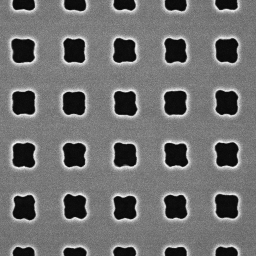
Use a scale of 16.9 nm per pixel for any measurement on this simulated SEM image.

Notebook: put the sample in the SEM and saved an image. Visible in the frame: a regular array of holes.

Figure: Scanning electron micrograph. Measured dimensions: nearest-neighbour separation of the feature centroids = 0.856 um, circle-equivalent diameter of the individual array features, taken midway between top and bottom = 422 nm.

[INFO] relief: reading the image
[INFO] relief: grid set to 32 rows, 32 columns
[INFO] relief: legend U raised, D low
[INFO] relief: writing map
UUDDUUUUDDDUUUDDDUUUUDDUUUUDDDUU
UUUUUUUUUUUUUUUUUUUUUUUUUUUUUUUU
UUUUUUUUUUUUUUUUUUUUUUUUUUUUUUUU
UUUUUUUUUUUUUUUUUUUUUUUUUUUUUUUU
UUUUUUUUUUUUUUUUUUUUUUUUUUUUUUUU
UDDDUUUUDDDUUUDDDUUUUDDUUUUDDDUU
UUDDUUUUDDDUUUDDDUUUUDDUUUUDDDUU
UUDDUUUUDDDUUUDDDUUUUDDUUUUDDDUU
UUUUUUUUUUUUUUUUUUUUUUUUUUUUUUUU
UUUUUUUUUUUUUUUUUUUUUUUUUUUUUUUU
UUUUUUUUUUUUUUUUUUUUUUUUUUUUUUUU
UUDDUUUUUDUUUUUDUUUUUDDUUUUDDUUU
UUDDUUUUDDDUUUDDDUUUUDDUUUUDDDUU
UUDDUUUUDDDUUUDDDUUUUDDUUUUDDDUU
UUUUUUUUUUUUUUUUUUUUUUUUUUUUUUUU
UUUUUUUUUUUUUUUUUUUUUUUUUUUUUUUU
UUUUUUUUUUUUUUUUUUUUUUUUUUUUUUUU
UUUUUUUUUUUUUUUUUUUUUUUUUUUUUUUU
UUDDUUUUDDDUUUDDDUUUUDDUUUUDDDUU
UUDDUUUUDDDUUUDDDUUUUDDUUUUDDDUU
UUDDUUUUDDDUUUDDDUUUUDDUUUUDDDUU
UUUUUUUUUUUUUUUUUUUUUUUUUUUUUUUU
UUUUUUUUUUUUUUUUUUUUUUUUUUUUUUUU
UUUUUUUUUUUUUUUUUUUUUUUUUUUUUUUU
UUDDUUUUDDUUUUUUUUUUUDDUUUUDDUUU
UUDDUUUUDDDUUUDDDUUUUDDUUUUDDDUU
UUDDUUUUDDDUUUDDDUUUUDDUUUUDDDUU
UUUUUUUUUUUUUUUUUUUUUUUUUUUUUUUU
UUUUUUUUUUUUUUUUUUUUUUUUUUUUUUUU
UUUUUUUUUUUUUUUUUUUUUUUUUUUUUUUU
UUUUUUUUUUUUUUUUUUUUUUUUUUUUUUUU
UUDDUUUUDDDUUUDDDUUUUDDUUUUDDDUU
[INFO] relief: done